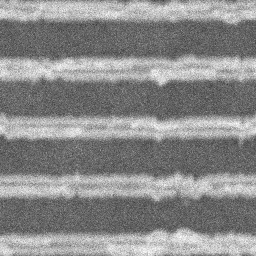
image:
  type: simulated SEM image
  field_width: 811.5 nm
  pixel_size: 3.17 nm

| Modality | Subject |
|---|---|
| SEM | parallel lines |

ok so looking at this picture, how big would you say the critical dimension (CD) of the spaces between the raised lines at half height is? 131 nm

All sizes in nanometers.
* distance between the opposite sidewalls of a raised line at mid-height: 53.5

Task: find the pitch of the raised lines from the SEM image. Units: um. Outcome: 0.185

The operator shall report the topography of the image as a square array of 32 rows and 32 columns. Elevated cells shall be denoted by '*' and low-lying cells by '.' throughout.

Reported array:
***************.**...*******.***
********************************
............................**..
................................
................................
................................
................................
.......................**...**..
********************************
********************************
................................
................................
................................
................................
................................
********************************
********************************
................................
................................
................................
................................
................................
*******************..***.*******
********************************
...................*....*.......
................................
................................
................................
................................
...............**.*******...**..
********************************
********.*********************.*